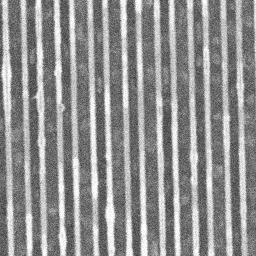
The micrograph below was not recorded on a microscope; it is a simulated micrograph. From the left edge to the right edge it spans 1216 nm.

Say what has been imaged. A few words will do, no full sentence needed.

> parallel lines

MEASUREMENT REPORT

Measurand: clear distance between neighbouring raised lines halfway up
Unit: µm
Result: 0.0579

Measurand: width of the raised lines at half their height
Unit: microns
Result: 0.0208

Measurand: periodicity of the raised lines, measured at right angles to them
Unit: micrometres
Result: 0.0791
